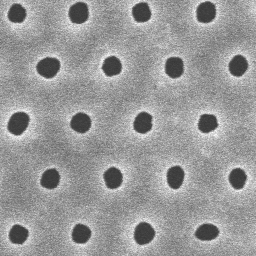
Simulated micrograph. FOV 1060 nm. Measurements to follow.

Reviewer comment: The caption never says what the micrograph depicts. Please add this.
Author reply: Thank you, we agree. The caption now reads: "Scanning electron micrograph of a regular array of holes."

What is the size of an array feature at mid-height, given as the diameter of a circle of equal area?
84.9 nm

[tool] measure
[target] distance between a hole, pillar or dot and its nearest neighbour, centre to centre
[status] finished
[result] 0.258 um